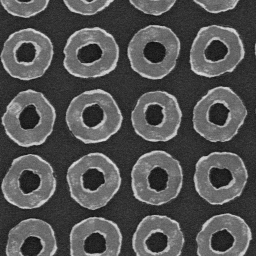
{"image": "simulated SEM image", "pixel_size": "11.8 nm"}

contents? a regular array of ring-shaped raised bodies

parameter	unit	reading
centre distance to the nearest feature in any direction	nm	734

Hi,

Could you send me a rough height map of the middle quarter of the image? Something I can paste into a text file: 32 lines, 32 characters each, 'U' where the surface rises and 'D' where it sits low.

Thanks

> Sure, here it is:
UUUUUUUUUUUUDDDDDUUUUUUUUUUDDDDD
DUUUUUUUUUUUDDDDDDUUUUUUUUUDDDDD
DDDUUUUUUUDDDDDDDDDUUUUUUUDDDDDD
DDDDDDDDDDDDDDDDDDDDDDUUDDDDDDDD
DDDDDDDDDDDDDDDDDDDDDDDDDDDDDDDD
DDDDDDDDDDDDDDDDDDDDDDDDDDDDDDDD
DDDDDDDDDDDDDDDDDDDDDDDDDDDDDDDD
DDDDUUUUUUUDDDDDDDDDUUUUUUDDDDDD
DDDUUUUUUUUUDDDDDDDUUUUUUUUDDDDD
DDUUUUUUUUUUDDDDDDDUUUUUUUUUDDDD
DUUUUUDDDUUUUDDDDDUUUDDDDUUUDDDD
DUUUUDDDDDUUUUDDDUUUDDDDDUUUUDDD
DUUUDDDDDDUUUUDDDUUUDDDDDUUUUDDD
DUUUDDDDDDUUUUDDDUUUDDDDDUUUUDDD
DUUUUDDDDDUUUUDDDUUUUDDDDUUUUDDD
DUUUUDDDUUUUUUDDDUUUUUUUUUUUUDDD
DDUUUUUUUUUUUDDDDDUUUUUUUUUUDDDD
DDUUUUUUUUUUDDDDDDDUUUUUUUUUDDDD
DDDDUUUUUUUDDDDDDDDDUUUUUUUDDDDD
DDDDDDDDDDDDDDDDDDDDDDDDDDDDDDDD
DDDDDDDDDDDDDDDDDDDDDDDDDDDDDDDD
DDDDDDDDDDDDDDDDDDDDDDDDDDDDDDDD
DDDDDDDDDDDDDDDDDDDDDUUUUUDDDDDD
DDDDUUUUUUUDDDDDDDDUUUUUUUUDDDDD
DDDUUUUUUUUDDDDDDDUUUUUUUUUUDDDD
DDUUUUUUUUUUUDDDDDUUUUUUUUUUUDDD
DUUUUUDDDUUUUDDDDUUUUUDDDUUUUDDD
DUUUUDDDDDUUUUDDDUUUUDDDDDUUUDDD
DUUUDDDDDDUUUUDDDUUUUDDDDDUUUUDD
DUUUDDDDDDUUUUDDDUUUUDDDDDUUUDDD
DUUUDDDDDUUUUUDDDUUUUDDDDDUUUDDD
DDUUUUDDUUUUUDDDDDUUUUDDDUUUUDDD